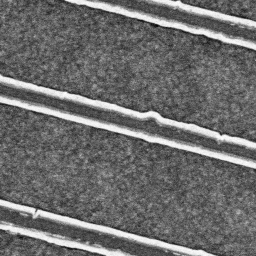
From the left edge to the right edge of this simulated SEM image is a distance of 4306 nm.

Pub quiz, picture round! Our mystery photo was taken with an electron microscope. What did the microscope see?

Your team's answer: one or a few lines or trenches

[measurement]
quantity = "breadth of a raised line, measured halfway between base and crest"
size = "350 nm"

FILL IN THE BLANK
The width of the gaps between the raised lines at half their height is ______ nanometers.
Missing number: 1670